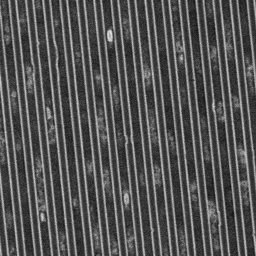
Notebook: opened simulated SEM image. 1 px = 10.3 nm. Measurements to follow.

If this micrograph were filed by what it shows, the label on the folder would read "parallel lines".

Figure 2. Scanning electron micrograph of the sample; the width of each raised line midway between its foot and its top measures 0.0745 micrometres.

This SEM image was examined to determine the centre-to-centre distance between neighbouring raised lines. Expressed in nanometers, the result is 175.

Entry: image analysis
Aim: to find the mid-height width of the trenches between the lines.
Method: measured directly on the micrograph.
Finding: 103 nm